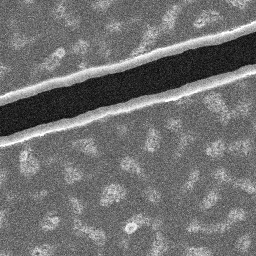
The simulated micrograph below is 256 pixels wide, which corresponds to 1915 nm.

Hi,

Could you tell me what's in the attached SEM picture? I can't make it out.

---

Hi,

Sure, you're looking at one or a few lines or trenches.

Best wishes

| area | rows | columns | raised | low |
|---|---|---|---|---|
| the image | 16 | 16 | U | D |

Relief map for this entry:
UUUUUUUUUUUUUUUU
UUUUUUUUUUUUUUUU
UUUUUUUUUUUUUDDD
UUUUUUUUUUDDDDDD
UUUUUUDDDDDDDDDU
UUUDDDDDDDDDUUUU
DDDDDDDDUUUUUUUU
DDDDDUUUUUUUUUUU
DUUUUUUUUUUUUUUU
UUUUUUUUUUUUUUUU
UUUUUUUUUUUUUUUU
UUUUUUUUUUUUUUUU
UUUUUUUUUUUUUUUU
UUUUUUUUUUUUUUUU
UUUUUUUUUUUUUUUU
UUUUUUUUUUUUUUUU